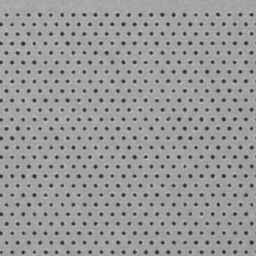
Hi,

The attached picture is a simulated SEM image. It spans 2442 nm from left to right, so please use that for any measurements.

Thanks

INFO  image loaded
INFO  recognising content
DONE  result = a regular array of holes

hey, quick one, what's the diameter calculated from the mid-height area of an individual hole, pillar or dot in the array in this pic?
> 38.8 nm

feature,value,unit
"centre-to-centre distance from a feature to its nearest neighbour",103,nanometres